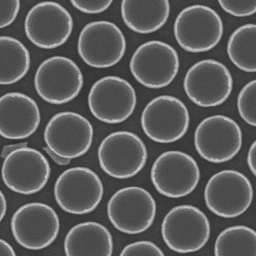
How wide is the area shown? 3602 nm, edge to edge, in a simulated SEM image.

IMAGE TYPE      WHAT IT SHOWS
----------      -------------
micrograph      a regular array of raised bodies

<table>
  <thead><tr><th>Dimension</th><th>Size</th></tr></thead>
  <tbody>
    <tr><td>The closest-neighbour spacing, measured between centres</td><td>783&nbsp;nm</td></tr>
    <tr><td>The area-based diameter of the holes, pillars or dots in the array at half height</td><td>644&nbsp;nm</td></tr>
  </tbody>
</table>